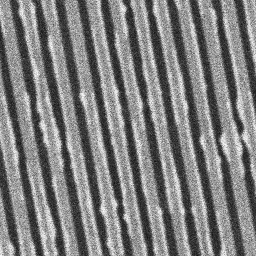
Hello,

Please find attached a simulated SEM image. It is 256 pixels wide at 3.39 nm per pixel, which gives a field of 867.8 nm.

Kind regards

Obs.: parallel lines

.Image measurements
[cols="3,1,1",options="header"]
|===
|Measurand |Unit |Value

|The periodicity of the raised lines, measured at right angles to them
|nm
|74.5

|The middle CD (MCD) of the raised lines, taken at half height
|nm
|43.7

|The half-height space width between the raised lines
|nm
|31.3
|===